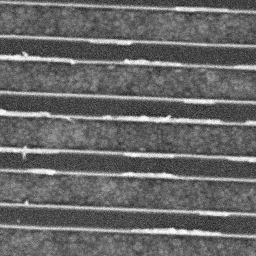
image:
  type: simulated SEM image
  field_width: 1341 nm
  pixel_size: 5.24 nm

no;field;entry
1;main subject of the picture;parallel lines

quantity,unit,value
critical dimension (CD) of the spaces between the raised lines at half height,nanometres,173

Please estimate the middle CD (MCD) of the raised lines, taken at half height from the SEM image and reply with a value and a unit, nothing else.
23 pixels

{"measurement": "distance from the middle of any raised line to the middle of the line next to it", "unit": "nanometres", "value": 293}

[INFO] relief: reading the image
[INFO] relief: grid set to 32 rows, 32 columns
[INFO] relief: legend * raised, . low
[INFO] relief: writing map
.....***************************
...............................*
................................
................................
.*..............................
************************........
********************************
.....***************************
..............................**
................................
................................
................................
************************........
********************************
......**************************
..............................**
................................
................................
................................
************************........
********************************
....****************************
..............................**
................................
................................
...*............................
************************.**.....
********************************
.....***************************
..............................**
................................
................................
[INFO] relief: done